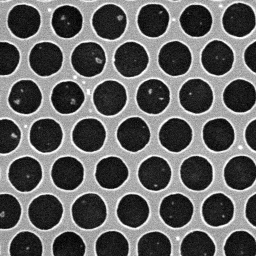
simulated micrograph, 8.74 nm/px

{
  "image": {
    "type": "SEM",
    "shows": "a regular array of holes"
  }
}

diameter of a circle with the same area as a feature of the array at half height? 300 nanometres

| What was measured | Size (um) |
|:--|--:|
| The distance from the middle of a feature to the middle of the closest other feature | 0.371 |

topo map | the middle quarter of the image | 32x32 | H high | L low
HHLLLLLLLLHHHLLLLLLLLHHHLLLLLLLL
HHHLLLLLLLHHHLLLLLLLHHHHHLLLLLLH
HHHHLLLLLHHHHHLLLLLHHHHHHHLLLLHH
HHHHHHHHHHHHHHHHHHHHHHHHHHHHHHHH
LLHHHHHHHHLLLLHHHHHHLLLLLHHHHHLL
LLLLHHHHLLLLLLLHHHHLLLLLLLHHHLLL
LLLLLHHHLLLLLLLHHHLLLLLLLLHHHLLL
LLLLLHHLLLLLLLLLHHLLLLLLLLLHHLLL
LLLLLHHLLLLLLLLLHHLLLLLLLLLHHLLL
LLLLLHHLLLLLLLLLHHLLLLLLLLHHHLLL
LLLLHHHHLLLLLLLHHHHLLLLLLLHHHLLL
LLLHHHHHLLLLLLHHHHHLLLLLLHHHHHLL
LLHHHHHHHLLLLHHHHHHHHLLLHHHHHHHH
HHHHHHLHHHHHHHHHLLLHHHHHHHHLLHHH
HHHHLLLLLHHHHHHLLLLLHHHHHLLLLLLH
HHHLLLLLLLHHHHLLLLLLLHHHLLLLLLLL
HHLLLLLLLLHHHLLLLLLLLLHHLLLLLLLL
HHLLLLLLLLLHHLLLLLLLLLHHLLLLLLLL
HHLLLLLLLLHHHLLLLLLLLLHHLLLLLLLL
HHLLLLLLLLHHHHLLLLLLLHHHLLLLLLLL
HHHLLLLLLLHHHHLLLLLLHHHHHLLLLLLH
HHHHLLLLLHHHHHHLLLLHHHHHHHLLLLHH
HHHHHHHHHHHHHHHHHHHHHHHHHHHHHHHH
LLLHHHHHHHLLLLHHHHHHHLLLLHHHHHHL
LLLLHHHHHLLLLLLHHHHHLLLLLLHHHHLL
LLLLLHHHLLLLLLLLHHHLLLLLLLHHHLLL
LLLLLHHHLLLLLLLLHHLLLLLLLLLHHLLL
LLLLLHHHLLLLLLLLHHLLLLLLLLLHHLLL
LLLLLHHHLLLLLLLLHHLLLLLLLLLHHLLL
LLLLLHHHLLLLLLLHHHHLLLLLLLHHHHLL
LLLLHHHHHLLLLLHHHHHHLLLLLLHHHHLL
LLLHHHHHHHHHHHHHHHHHHLLLHHHHHHHH